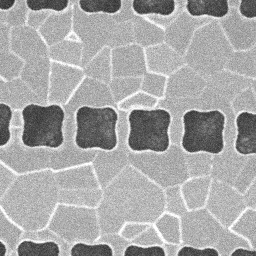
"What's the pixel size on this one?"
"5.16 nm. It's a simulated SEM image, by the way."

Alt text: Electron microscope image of holes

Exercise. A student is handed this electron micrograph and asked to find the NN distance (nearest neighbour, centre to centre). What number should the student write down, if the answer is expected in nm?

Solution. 274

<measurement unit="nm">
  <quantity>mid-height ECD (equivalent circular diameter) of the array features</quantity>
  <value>237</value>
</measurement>